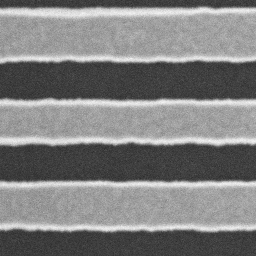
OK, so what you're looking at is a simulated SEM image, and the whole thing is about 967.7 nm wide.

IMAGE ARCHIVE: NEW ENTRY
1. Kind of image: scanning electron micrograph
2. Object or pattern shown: lines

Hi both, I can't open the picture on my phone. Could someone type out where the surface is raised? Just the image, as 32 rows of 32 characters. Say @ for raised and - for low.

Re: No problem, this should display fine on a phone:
--------------------------------
@@@@@@@@@-@@@@@@@@@@@@@@@@@@@@@@
@@@@@@@@@@@@@@@@@@@@@@@@@@@@@@@@
@@@@@@@@@@@@@@@@@@@@@@@@@@@@@@@@
@@@@@@@@@@@@@@@@@@@@@@@@@@@@@@@@
@@@@@@@@@@@@@@@@@@@@@@@@@@@@@@@@
@@@@@@@@@@@@@@@@@@@@@@@@@@@@@@@@
@@@-@@@@--@---@@@@@@@@@@----@@@@
--------------------------------
--------------------------------
--------------------------------
--------------------------------
------@-------------@-@-----@---
@@@@@@@@@@@@@@@@@@@@@@@@@@@@@@@@
@@@@@@@@@@@@@@@@@@@@@@@@@@@@@@@@
@@@@@@@@@@@@@@@@@@@@@@@@@@@@@@@@
@@@@@@@@@@@@@@@@@@@@@@@@@@@@@@@@
@@@@@@@@@@@@@@@@@@@@@@@@@@@@@@@@
--------------------------------
--------------------------------
--------------------------------
--------------------------------
--------------------------------
@@@@@@@@@@@@@@@@@@@@@@@@@@@@@@@@
@@@@@@@@@@@@@@@@@@@@@@@@@@@@@@@@
@@@@@@@@@@@@@@@@@@@@@@@@@@@@@@@@
@@@@@@@@@@@@@@@@@@@@@@@@@@@@@@@@
@@@@@@@@@@@@@@@@@@@@@@@@@@@@@@@@
@@@@@@@@@@@@@@@@@@@@@@@@@@@@@@@@
--------------------------------
--------------------------------
--------------------------------